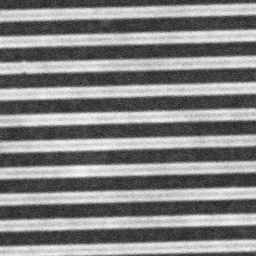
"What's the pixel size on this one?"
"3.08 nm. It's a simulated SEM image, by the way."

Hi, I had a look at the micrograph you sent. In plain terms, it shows parallel lines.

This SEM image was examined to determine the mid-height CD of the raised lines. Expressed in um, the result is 0.0308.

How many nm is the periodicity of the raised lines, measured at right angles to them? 80.9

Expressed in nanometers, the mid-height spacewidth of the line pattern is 50.1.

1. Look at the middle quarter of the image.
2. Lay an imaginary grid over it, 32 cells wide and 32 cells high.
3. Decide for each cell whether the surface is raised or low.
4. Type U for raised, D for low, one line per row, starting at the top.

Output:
UUUUUUUUUUUUUUUUUUUUUUUUUUUUUUUU
UUUUUUUUUUUUUDDDDDDDDDDDDDDDDDDD
DDDDDDDDDDDDDDDDDDDDDDDDDDDDDDDD
DDDDDDDDDDDDDDDDDDDDDDDDDDDDDDDD
DDDDDDDDDDDDDDDDDDDDDDDDDDDDDDDD
DDDDDDDDDDDDDDDDDDDDDDDDUUUUUUUU
UUUUUUUUUUUUUUUUUUUUUUUUUUUUUUUU
UUUUUUUUUUUUUUUUUUUUUUUUUDDUUUUU
DDDDDDDDDDDDDDDDDDDDDDDDDDDDDDDD
DDDDDDDDDDDDDDDDDDDDDDDDDDDDDDDD
DDDDDDDDDDDDDDDDDDDDDDDDDDDDDDDD
DDDDDDDDDDDDDDDDDDDDDDDDDDDDDDDD
DDDDDDDUUUUUUUUUUUUUUUUUUUUUUUUU
UUUUUUUUUUUUUUUUUUUUUUUUUUUUUUUU
UUUUUUUUUUUUUUUUUDDDDDDDDDDDDDDD
DDDDDDDDDDDDDDDDDDDDDDDDDDDDDDDD
DDDDDDDDDDDDDDDDDDDDDDDDDDDDDDDD
DDDDDDDDDDDDDDDDDDDDDDDDDDDDDDDD
DDDDDDDDDDDDDDDDDDDDDDDDDDDDUUUU
UUUUUUUUUUUUUUUUUUUUUUUUUUUUUUUU
UUUUUUUUUUUUUUUUUUUUUUUUUUUUUUUU
UDDDDDDDDDDDDDDDDDDDDDDDDDDDDDDD
DDDDDDDDDDDDDDDDDDDDDDDDDDDDDDDD
DDDDDDDDDDDDDDDDDDDDDDDDDDDDDDDD
DDDDDDDDDDDDDDDDDDDDDDDDDDDDDDDD
DDDDDDDDDDDDUUUUUUUUUUUUUUUUUUUU
UUUUUUUUUUUUUUUUUUUUUUUUUUUUUUUU
UUUUUUUUUUUUUUUUUUUUUUDDDDDDDDDD
DDDDDDDDDDDDDDDDDDDDDDDDDDDDDDDD
DDDDDDDDDDDDDDDDDDDDDDDDDDDDDDDD
DDDDDDDDDDDDDDDDDDDDDDDDDDDDDDDD
DDDDDDDDDDDDDDDDDDDDDDDDDDDDDDDD